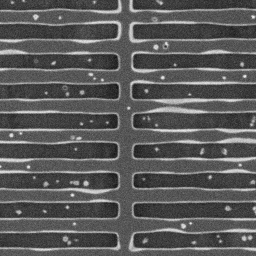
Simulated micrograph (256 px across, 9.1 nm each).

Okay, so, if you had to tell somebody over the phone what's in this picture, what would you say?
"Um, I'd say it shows groups of lines, slits or small figures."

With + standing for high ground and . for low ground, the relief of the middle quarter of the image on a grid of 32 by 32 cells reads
..............+++...............
+++++++......+++++......++++++++
++++++++++++++++++++++++++++++++
++++++++++++++++++++++++++++++++
++++++++++++++++++..++++++++++++
..............+++...............
..............+++...............
..............+++...............
.............++++...............
++++++++++++++++++++++++++++++++
++++++++++++++++++++++++++++++++
+++++++++++++++++++++++......+++
.............+++++..............
.............++++...............
..............+++...............
.............++++...............
+++++++.+++++++++++++++.........
++++++++++++++++++++++++++++++++
++++++++++++++++++++++++++++++++
+..........+++++++++++++++......
.............+++++..............
..............+++...............
..............+++...............
.............+++++..............
++++++++++++++++++++++++++++++++
++++++++++++++++++++++++++++++++
++++++++++++++++++++++++++++++++
.............+++++..............
..............+++...............
..............+++...............
.............++++...............
+++++......+++++++++++++++++++++